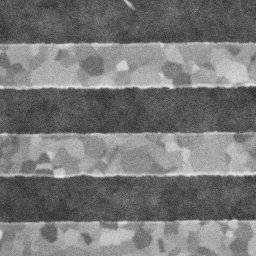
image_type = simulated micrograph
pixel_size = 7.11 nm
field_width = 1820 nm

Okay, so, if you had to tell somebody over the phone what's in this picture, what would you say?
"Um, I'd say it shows lines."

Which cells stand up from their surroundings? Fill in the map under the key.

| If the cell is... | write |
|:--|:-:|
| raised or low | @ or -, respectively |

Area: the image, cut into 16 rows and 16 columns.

----------------
----------------
----------------
@@@@@@@@@@@@@@@@
@@@@@@@@@@@@@@@@
-@--------------
----------------
----------------
@@@@@@@@@@@@@@@@
@@@@@@@@@@@@@@@@
@@@@@@@@@@@@@@@@
----------------
----------------
----------------
@@@@@@@@@@@@@@@@
@@@@@@@@@@@@@@@@